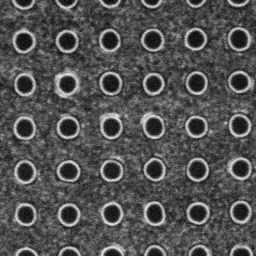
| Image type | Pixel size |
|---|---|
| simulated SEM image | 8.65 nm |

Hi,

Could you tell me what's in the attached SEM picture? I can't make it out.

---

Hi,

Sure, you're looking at a regular array of raised bodies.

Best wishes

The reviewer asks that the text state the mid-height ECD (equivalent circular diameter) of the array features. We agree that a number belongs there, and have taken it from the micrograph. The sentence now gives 184 nanometers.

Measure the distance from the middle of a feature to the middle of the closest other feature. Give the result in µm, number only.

0.367